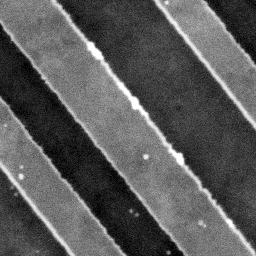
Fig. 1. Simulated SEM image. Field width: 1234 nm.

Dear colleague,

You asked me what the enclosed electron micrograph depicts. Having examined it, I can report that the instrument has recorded lines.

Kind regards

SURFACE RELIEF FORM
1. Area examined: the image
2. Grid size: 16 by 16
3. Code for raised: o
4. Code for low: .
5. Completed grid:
oooo......ooo...
oooo.......ooo..
.oooo.......ooo.
..oooo.......ooo
..ooooo......ooo
...ooooo......oo
....ooooo......o
o....oooo.......
oo....oooo......
ooo...ooooo.....
ooo....ooooo....
.ooo....oooo....
..ooo....oooo...
...ooo....oooo..
...oooo...ooooo.
....ooo....ooooo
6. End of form